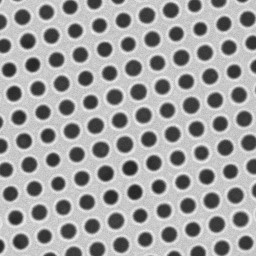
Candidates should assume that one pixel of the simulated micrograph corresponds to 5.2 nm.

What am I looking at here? a regular array of holes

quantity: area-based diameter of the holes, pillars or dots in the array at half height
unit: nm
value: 86.2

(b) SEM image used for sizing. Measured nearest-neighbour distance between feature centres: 126 nm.